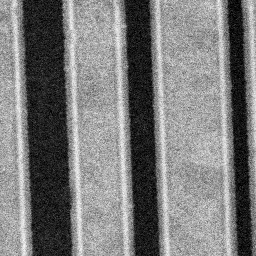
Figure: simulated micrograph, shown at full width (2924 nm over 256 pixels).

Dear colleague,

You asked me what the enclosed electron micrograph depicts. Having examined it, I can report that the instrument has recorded one or a few lines or trenches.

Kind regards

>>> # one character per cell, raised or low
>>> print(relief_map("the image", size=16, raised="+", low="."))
+...+++...++++..
+...+++...++++..
+....++...++++..
+....++...++++..
+....++...++++..
+....+++..++++..
+....+++..++++..
+....+++..++++..
+....+++..++++..
+....+++..++++..
+....+++..++++..
+....+++..++++..
+....+++..++++..
+....+++..++++..
+....+++..++++..
+....+++..++++..